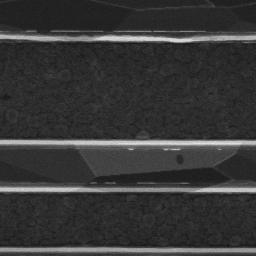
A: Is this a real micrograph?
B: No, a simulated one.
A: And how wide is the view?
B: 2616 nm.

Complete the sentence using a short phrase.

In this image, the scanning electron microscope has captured one or a few lines or trenches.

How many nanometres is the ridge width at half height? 477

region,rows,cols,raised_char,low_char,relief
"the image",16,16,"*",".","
****************
****************
................
................
................
................
................
................
................
****************
****************
****************
................
................
................
................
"